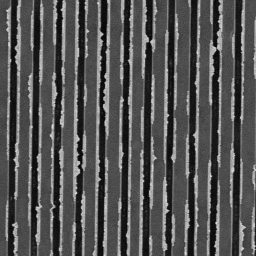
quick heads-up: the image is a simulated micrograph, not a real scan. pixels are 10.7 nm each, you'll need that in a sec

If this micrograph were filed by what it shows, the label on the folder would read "parallel lines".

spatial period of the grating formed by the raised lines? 0.24 micrometres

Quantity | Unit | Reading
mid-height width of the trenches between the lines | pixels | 6.62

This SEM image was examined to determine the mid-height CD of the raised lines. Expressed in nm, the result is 167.